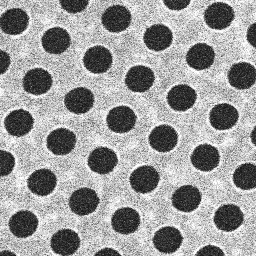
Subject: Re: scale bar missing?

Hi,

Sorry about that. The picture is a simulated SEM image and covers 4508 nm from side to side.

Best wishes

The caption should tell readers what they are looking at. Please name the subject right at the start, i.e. a regular array of holes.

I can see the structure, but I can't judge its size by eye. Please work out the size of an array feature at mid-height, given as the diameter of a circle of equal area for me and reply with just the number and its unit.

523 nm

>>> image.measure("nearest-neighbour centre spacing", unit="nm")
791